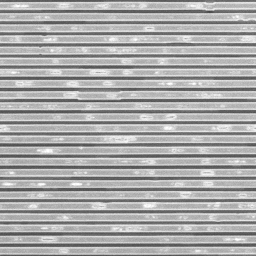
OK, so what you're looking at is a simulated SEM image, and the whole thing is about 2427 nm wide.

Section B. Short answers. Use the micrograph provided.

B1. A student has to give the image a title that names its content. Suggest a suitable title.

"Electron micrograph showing parallel lines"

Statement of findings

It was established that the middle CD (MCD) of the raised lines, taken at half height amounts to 71.1 nm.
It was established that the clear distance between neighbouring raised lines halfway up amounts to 35.5 nm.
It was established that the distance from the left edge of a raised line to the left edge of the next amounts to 0.105 micrometres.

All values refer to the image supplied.